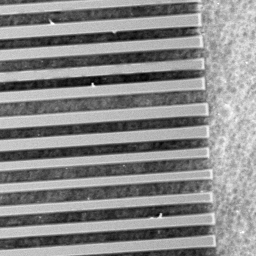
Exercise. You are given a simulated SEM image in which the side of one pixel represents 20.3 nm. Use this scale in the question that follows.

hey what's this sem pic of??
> parallel lines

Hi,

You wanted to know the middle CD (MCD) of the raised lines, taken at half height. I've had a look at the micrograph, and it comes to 218 nm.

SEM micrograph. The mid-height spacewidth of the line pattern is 238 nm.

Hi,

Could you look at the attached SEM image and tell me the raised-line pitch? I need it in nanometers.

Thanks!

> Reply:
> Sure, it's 451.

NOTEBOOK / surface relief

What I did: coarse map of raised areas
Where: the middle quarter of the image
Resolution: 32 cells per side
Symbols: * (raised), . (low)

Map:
...........*********************
***************************.....
************....................
................................
......................**********
.......*************************
*****************************...
***************.................
................................
................................
..........................******
............********************
********************************
**********************..........
********........................
................................
.....................***********
......**************************
*******************************.
*****************...............
**..............................
..............................**
...............*****************
.******************************.
****************................
**..............................
................................
.....................**.********
.......*************************
**********************..........
*******.........................
................................